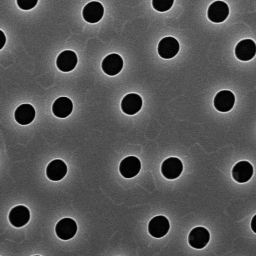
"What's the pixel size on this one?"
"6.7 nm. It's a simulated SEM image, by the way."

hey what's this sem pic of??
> a regular array of holes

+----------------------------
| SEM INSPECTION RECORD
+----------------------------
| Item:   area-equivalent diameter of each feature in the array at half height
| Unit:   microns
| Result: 0.145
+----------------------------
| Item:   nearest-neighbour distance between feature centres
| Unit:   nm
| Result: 300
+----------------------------